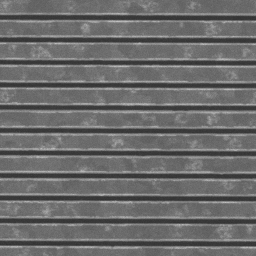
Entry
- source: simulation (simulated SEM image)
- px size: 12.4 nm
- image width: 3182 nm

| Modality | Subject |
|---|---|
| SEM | parallel lines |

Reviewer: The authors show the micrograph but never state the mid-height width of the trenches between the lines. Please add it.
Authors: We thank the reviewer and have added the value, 69.9 nanometers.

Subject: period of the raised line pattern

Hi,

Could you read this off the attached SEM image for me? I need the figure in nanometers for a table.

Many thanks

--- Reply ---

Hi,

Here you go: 281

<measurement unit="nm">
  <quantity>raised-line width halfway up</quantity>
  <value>210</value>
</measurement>